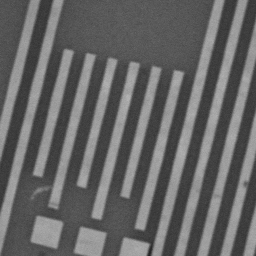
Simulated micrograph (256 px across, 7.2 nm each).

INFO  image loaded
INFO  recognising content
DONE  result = groups of lines, slits or small figures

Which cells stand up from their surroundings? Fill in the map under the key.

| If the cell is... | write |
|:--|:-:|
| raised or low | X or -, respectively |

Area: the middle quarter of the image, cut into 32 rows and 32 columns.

X----XX----XX---XXX-------------
X----XX----XX---XX----XX--------
X---XXX---XX----XX----XX---XXX--
X---XX----XX----XX---XXX---XXX--
----XX----XX---XXX---XX----XX---
----XX----X----XX----XX----XX---
---XXX---XX----XX----XX---XXX---
---XXX---XX----XX---XXX---XXX---
---XX----XX---XXX---XX----XX----
---XX---XXX---XX----XX----XX---X
--XXX---XXX---XX----XX---XXX---X
--XXX---XX----XX---XXX---XXX---X
--XX----XX---XXX---XX----XX----X
--XX----XX---XX----XX----XX---XX
-XXX---XXX---XX----XX---XXX---XX
-XXX---XX----XX---XXX---XXX---XX
-XX----XX---XXX---XX----XX----XX
-XX----XX---XX----XX----XX---XXX
XXX---XXX---XX----XX---XXX---XXX
XXX---XX----XX---XXX---XXX---XX-
XX----XX---XXX---XX----XX----XX-
XX----XX---XX----XX----XX---XXX-
XX---XXX---XX----XX---XXX---XXX-
X----XX----XX---XXX---XXX---XX--
X----XX---XXX---XX----XX----XX--
X----XX---XX----XX----XX---XXX--
X---XXX---XX----XX---XXX---XXX--
----XX----XX---XXX---XXX---XX---
----XX---XXX---XX----XX----XX---
---XXX---XX----XX----XX---XXX---
----XX---XX----XX---XXX---XXX---
---------XX---XXX---XXX---XX----